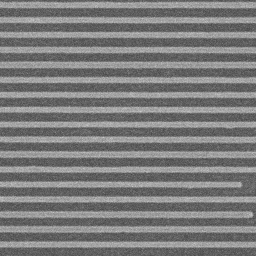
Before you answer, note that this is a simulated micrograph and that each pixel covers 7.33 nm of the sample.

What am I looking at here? parallel lines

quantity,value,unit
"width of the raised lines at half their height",36.6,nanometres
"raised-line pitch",0.11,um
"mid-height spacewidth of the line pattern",0.0724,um